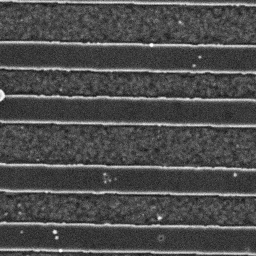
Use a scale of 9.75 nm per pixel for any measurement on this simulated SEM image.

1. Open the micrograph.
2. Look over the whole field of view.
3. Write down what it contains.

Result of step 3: lines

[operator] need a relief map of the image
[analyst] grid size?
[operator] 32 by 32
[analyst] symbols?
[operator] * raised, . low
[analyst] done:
......................**********
................................
................................
................................
................................
********************............
********************************
********************************
********************************
................................
................................
................................
********************************
********************************
********************************
............********************
................................
................................
................................
................................
*...............................
********************************
********************************
********************************
................................
................................
................................
................................
********************************
********************************
********************************
..................**************